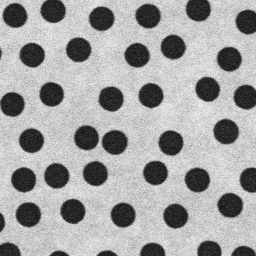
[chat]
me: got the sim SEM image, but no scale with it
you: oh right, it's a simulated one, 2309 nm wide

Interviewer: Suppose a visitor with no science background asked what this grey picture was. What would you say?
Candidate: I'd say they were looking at a regular array of holes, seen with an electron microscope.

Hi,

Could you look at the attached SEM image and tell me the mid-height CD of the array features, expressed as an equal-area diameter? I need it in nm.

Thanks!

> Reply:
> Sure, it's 224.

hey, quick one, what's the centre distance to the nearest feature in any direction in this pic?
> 350 nm